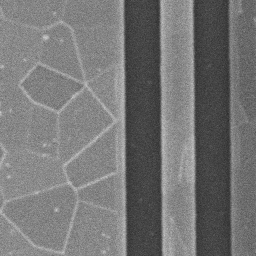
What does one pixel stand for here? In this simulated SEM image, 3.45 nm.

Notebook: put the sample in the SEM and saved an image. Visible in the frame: wiring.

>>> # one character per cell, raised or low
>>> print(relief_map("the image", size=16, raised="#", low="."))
########..##..##
########..##..##
########..##..##
########..##..##
########..##..##
########..##..##
########..##..##
########..##..##
########..##..##
########..##..##
########..##..##
########..##..##
########..##..##
########..##..##
########..##..##
########..##..##